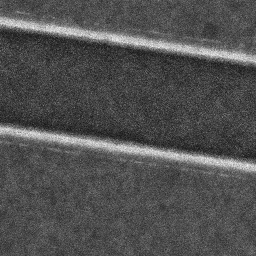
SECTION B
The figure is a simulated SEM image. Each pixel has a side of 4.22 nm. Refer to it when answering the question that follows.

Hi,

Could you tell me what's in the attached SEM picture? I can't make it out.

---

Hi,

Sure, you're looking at one or a few lines or trenches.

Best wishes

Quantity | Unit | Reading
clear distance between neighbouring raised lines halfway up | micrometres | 0.457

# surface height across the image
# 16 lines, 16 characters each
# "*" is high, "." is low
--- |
****************
.***************
........********
...............*
................
................
................
................
***.............
*********.......
****************
****************
****************
****************
****************
****************